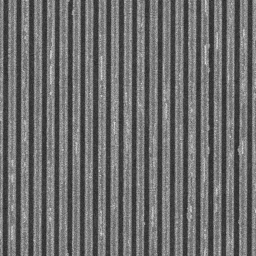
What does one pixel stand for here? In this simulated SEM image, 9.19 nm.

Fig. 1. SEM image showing parallel lines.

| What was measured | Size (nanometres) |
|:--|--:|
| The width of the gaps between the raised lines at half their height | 57.4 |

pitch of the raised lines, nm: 118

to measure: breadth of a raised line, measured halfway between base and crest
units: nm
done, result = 57.4